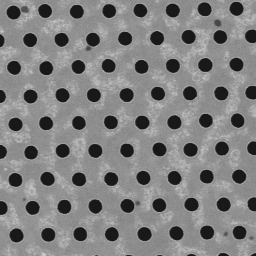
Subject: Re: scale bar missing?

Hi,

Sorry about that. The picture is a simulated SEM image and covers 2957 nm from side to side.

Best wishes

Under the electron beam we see a regular array of holes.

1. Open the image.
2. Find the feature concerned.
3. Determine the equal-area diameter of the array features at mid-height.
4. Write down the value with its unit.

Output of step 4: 0.16 µm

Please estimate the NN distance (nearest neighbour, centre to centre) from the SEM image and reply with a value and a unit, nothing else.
362 nanometers